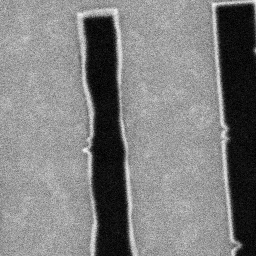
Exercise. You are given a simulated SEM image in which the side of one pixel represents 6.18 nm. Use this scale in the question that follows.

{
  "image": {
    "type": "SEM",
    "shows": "one or a few lines or trenches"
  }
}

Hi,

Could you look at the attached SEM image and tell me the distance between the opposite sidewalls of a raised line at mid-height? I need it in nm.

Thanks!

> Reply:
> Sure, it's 232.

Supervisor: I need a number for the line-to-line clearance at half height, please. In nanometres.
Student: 599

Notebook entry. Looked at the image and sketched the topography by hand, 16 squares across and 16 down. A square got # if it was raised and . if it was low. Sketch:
.............###
.....##......###
.....##......###
.....###......##
.....###......##
.....###......##
......##......##
......##......##
......##......##
......##......##
......##......##
......##......##
......##......##
......##......##
......##......##
......##.......#